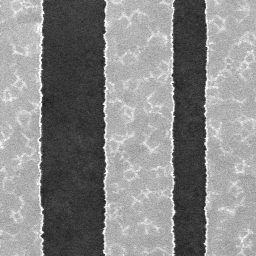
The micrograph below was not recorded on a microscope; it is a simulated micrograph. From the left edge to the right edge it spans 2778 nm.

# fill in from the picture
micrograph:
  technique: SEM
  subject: one or a few lines or trenches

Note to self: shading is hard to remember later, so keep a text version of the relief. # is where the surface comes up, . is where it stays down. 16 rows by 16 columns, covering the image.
###....####..###
###....####..###
###....####..###
###....####..###
###....####..###
###....####..###
###....####..###
###....####..###
###....####..###
###....####..###
###....####..###
###....####..###
###....####..###
###....####..###
###....####..###
###....####..###